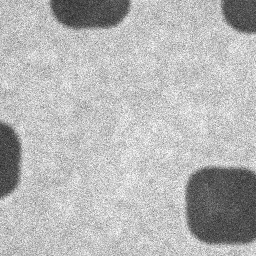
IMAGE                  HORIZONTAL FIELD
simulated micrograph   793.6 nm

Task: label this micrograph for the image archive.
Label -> holes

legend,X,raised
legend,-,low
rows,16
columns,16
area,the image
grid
XXX-----XXXXXX--
XXXX---XXXXXXX--
XXXXXXXXXXXXXXXX
XXXXXXXXXXXXXXXX
XXXXXXXXXXXXXXXX
XXXXXXXXXXXXXXXX
XXXXXXXXXXXXXXXX
XXXXXXXXXXXXXXXX
-XXXXXXXXXXXXXXX
-XXXXXXXXXXXXXXX
-XXXXXXXXXXXX--X
-XXXXXXXXXXX----
XXXXXXXXXXXX----
XXXXXXXXXXXX----
XXXXXXXXXXXX----
XXXXXXXXXXXXXXXX